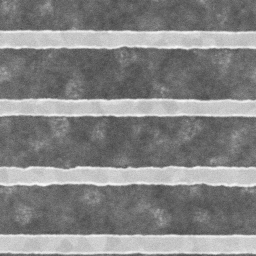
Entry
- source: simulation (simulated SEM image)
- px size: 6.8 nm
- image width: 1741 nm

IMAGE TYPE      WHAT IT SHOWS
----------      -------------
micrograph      one or a few lines or trenches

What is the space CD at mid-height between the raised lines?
354 nm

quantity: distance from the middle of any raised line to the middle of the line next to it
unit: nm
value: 464